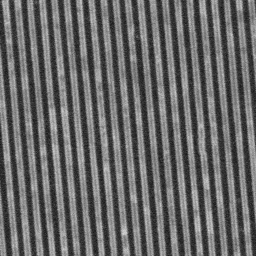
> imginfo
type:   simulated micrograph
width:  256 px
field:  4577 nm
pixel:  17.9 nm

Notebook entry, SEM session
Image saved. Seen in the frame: parallel lines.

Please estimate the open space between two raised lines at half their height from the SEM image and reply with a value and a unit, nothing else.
149 nanometres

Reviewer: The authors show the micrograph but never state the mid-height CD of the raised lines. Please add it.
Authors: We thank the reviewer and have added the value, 4.6 px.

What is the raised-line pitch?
219 nm